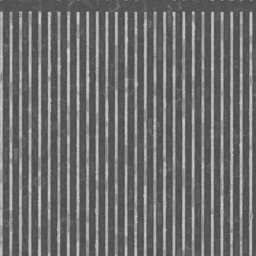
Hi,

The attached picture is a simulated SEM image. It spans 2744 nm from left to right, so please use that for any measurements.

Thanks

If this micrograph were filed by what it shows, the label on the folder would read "parallel lines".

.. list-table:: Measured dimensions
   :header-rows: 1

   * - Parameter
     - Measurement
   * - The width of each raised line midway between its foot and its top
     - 21.4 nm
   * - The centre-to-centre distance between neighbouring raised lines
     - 103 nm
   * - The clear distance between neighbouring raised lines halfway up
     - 83.1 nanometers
